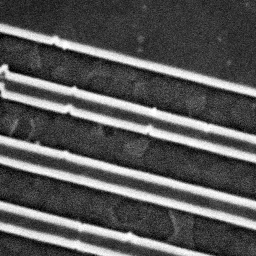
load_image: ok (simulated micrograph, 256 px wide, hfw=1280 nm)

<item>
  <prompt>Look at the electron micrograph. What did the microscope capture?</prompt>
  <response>one or a few lines or trenches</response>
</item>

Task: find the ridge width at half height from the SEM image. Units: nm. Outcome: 104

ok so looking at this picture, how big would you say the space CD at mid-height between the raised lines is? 218 nanometers